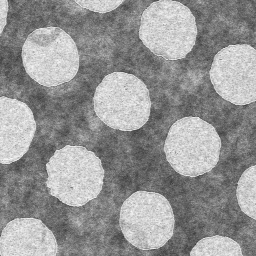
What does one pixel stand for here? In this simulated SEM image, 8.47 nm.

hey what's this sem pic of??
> raised bodies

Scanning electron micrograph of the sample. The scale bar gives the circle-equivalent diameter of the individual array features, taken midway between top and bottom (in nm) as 472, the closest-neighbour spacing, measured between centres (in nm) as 720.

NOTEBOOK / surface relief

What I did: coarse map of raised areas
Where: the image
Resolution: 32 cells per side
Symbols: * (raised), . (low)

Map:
*.........*****....****.........
*...........*.....******........
*.................******........
......*...........*******.......
....*****........*******........
...******.........******........
...*******.........*****...*****
...*******.................*****
...*******................******
....*****....****.........******
......*......*****.........*****
............******.........*****
**..........*******.........****
****........*******.............
****........*******.............
****.........*****....****......
****.................******.....
****.................******.....
****....**...........******.....
***....*****.........******.....
......*******........******.....
......*******.........****.....*
......*******.................**
......*******.................**
.......*****....****..........**
.........*.....******.........**
...............*******........**
..***..........*******..........
.*****.........*******..........
*******.........*****...........
*******..........****....*****..
*******.................******..